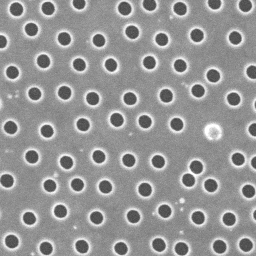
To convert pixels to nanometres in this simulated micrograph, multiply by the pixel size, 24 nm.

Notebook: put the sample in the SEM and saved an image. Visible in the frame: a regular array of holes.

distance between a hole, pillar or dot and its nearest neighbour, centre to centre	694	nm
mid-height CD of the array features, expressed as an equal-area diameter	14.1	pixels